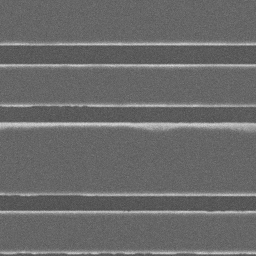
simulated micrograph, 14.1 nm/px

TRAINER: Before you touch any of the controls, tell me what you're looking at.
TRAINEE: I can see lines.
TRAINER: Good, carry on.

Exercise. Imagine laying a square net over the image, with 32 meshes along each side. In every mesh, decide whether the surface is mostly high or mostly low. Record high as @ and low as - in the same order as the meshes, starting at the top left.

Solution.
@@@@@@@@@@@@@@@@@@@@@@@@@@@@@@@@
@@@@@@@@@@@@@@@@@@@@@@@@@@@@@@@@
@@@@@@@@@@@@@@@@@@@@@@@@@@@@@@@@
@@@@@@@@@@@@@@@@@@@@@@@@@@@@@@@@
@@@@@@@@@@@@@@@@@@@@@@@@@@@@@@@@
@@@@@@@@@@@@@@@@@@@@@@@@@@@@@@@@
--------------------------------
--------------------------------
@@@@@@@@@@@@@@@@@@@@@@@@@@@@@@@@
@@@@@@@@@@@@@@@@@@@@@@@@@@@@@@@@
@@@@@@@@@@@@@@@@@@@@@@@@@@@@@@@@
@@@@@@@@@@@@@@@@@@@@@@@@@@@@@@@@
@@@@@@@@@@@@@@@@@@@@@@@@@@@@@@@@
--------------------------------
--------------------------------
@@@@@@@@@@@@@@@@@-----@@--------
@@@@@@@@@@@@@@@@@@@@@@@@@@@@@@@@
@@@@@@@@@@@@@@@@@@@@@@@@@@@@@@@@
@@@@@@@@@@@@@@@@@@@@@@@@@@@@@@@@
@@@@@@@@@@@@@@@@@@@@@@@@@@@@@@@@
@@@@@@@@@@@@@@@@@@@@@@@@@@@@@@@@
@@@@@@@@@@@@@@@@@@@@@@@@@@@@@@@@
@@@@@@@@@@@@@@@@@@@@@@@@@@@@@@@@
@@@@@@@@@@@@@@@@@@@@@@@@@@@@@@@@
--------------------------------
--------------------------------
@@@@@@@@@@@@@@@-@@@@@@@@@@--@-@@
@@@@@@@@@@@@@@@@@@@@@@@@@@@@@@@@
@@@@@@@@@@@@@@@@@@@@@@@@@@@@@@@@
@@@@@@@@@@@@@@@@@@@@@@@@@@@@@@@@
@@@@@@@@@@@@@@@@@@@@@@@@@@@@@@@@
@@@@@@@@@@@@@@@@@@@@@@@@@@@@@@@@